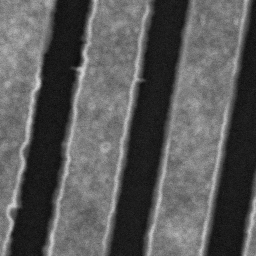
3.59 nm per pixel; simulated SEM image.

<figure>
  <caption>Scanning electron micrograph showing one or a few lines or trenches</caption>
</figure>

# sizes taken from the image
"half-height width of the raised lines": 217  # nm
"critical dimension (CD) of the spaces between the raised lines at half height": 130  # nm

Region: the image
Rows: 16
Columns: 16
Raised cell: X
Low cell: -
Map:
XXX---XXX---XXXX
XXX--XXXX---XXX-
XXX--XXXX--XXXX-
XXX--XXXX--XXXX-
XXX--XXXX--XXXX-
XX---XXXX--XXXX-
XX--XXXX---XXXX-
XX--XXXX---XXX--
XX--XXXX--XXXX--
XX--XXXX--XXXX--
XX--XXXX--XXXX--
X---XXXX--XXXX--
X--XXXX---XXX---
X--XXXX--XXXX---
X--XXXX--XXXX--X
X--XXXX--XXXX--X